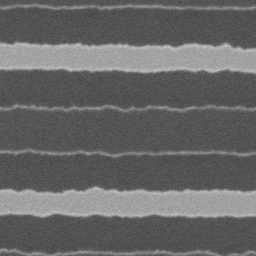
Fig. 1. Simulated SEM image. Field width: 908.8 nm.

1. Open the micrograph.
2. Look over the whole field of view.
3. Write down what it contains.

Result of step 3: lines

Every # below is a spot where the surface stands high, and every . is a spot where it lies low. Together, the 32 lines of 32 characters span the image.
################################
................................
................................
................................
................................
####.....#......................
################################
################################
################################
................................
................................
................................
................................
.#####...#..###...###...#######.
################################
################################
################################
################################
################################
..............#.................
................................
................................
................................
................................
################################
################################
################################
................................
................................
................................
................................
###......###.....####...##.....#